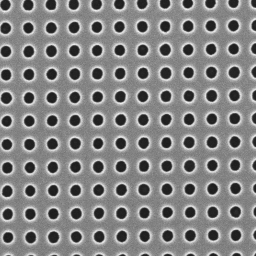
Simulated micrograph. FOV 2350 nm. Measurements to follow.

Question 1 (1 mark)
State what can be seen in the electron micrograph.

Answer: a regular array of holes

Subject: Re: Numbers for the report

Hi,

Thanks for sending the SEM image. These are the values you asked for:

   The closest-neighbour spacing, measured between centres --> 207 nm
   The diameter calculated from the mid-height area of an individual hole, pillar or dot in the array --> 105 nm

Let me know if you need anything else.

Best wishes